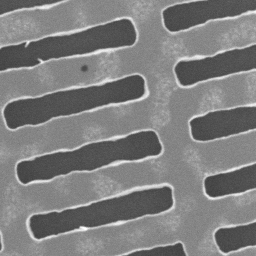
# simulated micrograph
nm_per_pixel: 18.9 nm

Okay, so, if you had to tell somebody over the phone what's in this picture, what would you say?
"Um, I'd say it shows holes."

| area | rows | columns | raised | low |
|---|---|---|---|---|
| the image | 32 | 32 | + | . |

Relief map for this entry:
.......+++++++++++++++..........
.+++++++++++++++++++...........+
+++++++++++++++.++++......++++++
+++++++++++......++++...++++++++
++++++...........+++++++++++++++
++...............+++++++++++++++
............++++++++++++++++....
......+++++++++++++++++.........
..++++++++++++++++++++..........
++++++++++++++++..++++......++++
++++++++++++......++++..++++++++
+++++++...........++++++++++++++
++...............+++++++++++++++
+...........+++++++++++++++++...
........+++++++++++++++++.......
+....+++++++++++++++++++........
+++++++++++++++++..+++++......++
+++++++++++++.......+++++.++++++
++++++++++..........++++++++++++
+++++..............+++++++++++++
++............++++++++++++++++++
++.......+++++++++++++++++++....
++...+++++++++++++++++++++......
+++++++++++++++++++..+++++......
+++++++++++++++.......++++..++++
+++++++++++...........++++++++++
++++++..............++++++++++++
++++............++++++++++++++++
++++......++++++++++++++++++....
++++..+++++++++++++++++++++.....
++++++++++++++++++++++.++++.....
+++++++++++++++++......+++++.+++